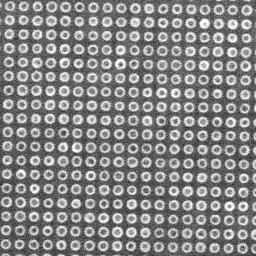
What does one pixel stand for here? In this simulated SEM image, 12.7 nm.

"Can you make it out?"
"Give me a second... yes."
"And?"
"a regular array of raised bodies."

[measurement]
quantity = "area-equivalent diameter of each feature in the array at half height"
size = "106 nanometers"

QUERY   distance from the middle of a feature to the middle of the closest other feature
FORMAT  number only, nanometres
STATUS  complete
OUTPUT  175